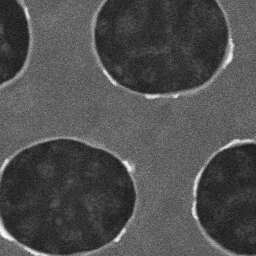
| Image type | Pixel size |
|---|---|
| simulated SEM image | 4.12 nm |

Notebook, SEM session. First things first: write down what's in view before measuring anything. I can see holes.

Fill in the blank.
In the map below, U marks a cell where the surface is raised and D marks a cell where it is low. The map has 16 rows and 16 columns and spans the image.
DUUUUUDDDDDDDDUU
DDUUUUDDDDDDDDUU
DDUUUUDDDDDDDDUU
DDUUUUDDDDDDDDUU
DUUUUUUDDDDDDDUU
UUUUUUUUDDDDUUUU
UUUUUUUUUUUUUUUU
UUUUUUUUUUUUUUUU
UUUUUUUUUUUUUUUU
UDDDDDDUUUUUUUDD
DDDDDDDDUUUUUDDD
DDDDDDDDUUUUDDDD
DDDDDDDDUUUUDDDD
DDDDDDDDUUUUDDDD
UDDDDDDDUUUUUDDD
UUDDDDUUUUUUUUDD